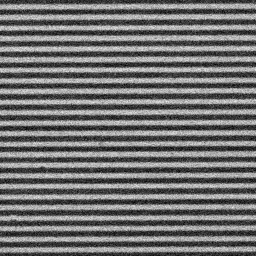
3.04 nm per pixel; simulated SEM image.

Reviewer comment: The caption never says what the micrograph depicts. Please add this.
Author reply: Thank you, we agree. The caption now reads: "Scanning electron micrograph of parallel lines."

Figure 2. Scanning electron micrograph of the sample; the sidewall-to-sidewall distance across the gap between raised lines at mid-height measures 16.7 nanometres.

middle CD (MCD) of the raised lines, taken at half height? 14.1 nm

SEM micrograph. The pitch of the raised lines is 32.1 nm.